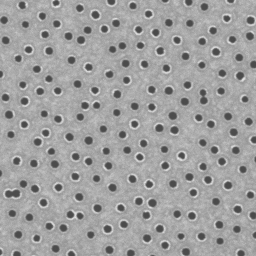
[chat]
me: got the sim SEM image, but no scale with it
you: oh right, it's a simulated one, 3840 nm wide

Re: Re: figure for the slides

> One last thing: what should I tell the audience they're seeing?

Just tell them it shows a regular array of holes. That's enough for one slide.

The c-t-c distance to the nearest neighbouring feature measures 0.249 micrometres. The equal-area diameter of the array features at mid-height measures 118 nm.